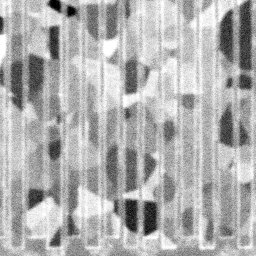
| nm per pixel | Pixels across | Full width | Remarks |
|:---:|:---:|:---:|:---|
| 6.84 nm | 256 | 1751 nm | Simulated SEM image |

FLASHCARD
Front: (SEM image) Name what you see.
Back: parallel lines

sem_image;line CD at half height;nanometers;95.8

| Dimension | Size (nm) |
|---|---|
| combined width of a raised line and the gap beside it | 130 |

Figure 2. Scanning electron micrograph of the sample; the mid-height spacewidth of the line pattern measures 36.8 nm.